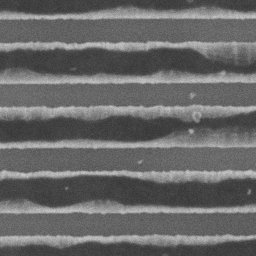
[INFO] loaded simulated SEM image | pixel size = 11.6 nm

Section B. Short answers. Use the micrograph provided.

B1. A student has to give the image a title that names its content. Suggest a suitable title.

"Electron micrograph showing lines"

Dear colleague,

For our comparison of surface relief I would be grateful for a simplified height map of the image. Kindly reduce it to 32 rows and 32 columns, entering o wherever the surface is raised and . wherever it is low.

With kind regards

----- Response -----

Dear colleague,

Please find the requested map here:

oooooooooooooooooooooooooooooooo
oooooooooooooooooooooooooooooooo
................................
................................
................................
..ooo.oo...ooo....ooooooo.......
oooooooooooooooooooooooooooooooo
oooooooooooooooooooooooooooooooo
oooooooooooooooooooooooooooooooo
oooooooooooooooooooooooooooooooo
................................
................................
................................
...............................o
oooooooooooooooooooooooooooooooo
oooooooooooooooooooooooooooooooo
oooooooooooooooooooooooooooooooo
oooooooooooooooooooooooooooooooo
................................
................................
................................
..............oo................
oooooooooooooooooooooooooooooooo
oooooooooooooooooooooooooooooooo
oooooooooooooooooooooooooooooooo
oooooooooooooooooooooooooooooooo
................................
................................
................................
................................
oooooooooooooooooooooooooooooooo
oooooooooooooooooooooooooooooooo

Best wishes